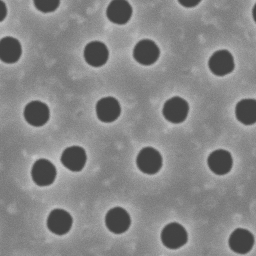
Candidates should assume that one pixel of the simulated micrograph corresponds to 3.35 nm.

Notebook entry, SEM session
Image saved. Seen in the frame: a regular array of holes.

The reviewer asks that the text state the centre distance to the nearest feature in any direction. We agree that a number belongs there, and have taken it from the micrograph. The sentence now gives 192 nm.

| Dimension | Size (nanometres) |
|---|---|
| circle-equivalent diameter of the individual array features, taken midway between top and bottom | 87.1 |